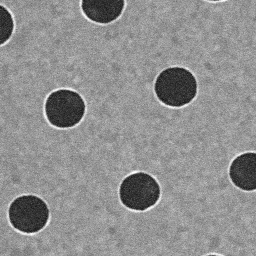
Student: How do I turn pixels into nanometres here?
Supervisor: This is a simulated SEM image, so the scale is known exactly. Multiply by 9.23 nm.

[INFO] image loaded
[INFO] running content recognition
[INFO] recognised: holes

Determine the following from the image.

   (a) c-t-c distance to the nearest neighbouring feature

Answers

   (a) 1030 nm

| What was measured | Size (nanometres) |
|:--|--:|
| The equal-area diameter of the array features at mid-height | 374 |